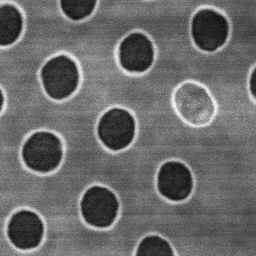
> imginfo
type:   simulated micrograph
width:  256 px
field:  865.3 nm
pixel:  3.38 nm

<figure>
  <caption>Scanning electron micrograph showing a regular array of holes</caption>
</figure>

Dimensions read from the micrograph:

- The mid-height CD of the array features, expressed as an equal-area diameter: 137 nm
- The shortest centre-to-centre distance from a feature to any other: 260 nm